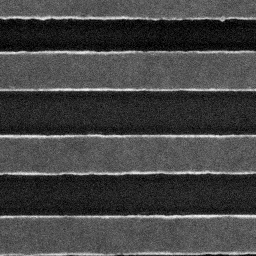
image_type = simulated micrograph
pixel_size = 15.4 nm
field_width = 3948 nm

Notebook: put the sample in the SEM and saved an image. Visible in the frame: lines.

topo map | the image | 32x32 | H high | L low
HHHHHHHHHHHHHHHHHHHHHHHHHHHHHHHH
HHHHHHHHHHHHHHHHHHHHHHHHHHHHHHHH
LLLLLLLLLLLLLLLLLLLLLLLLLLLHLLLL
LLLLLLLLLLLLLLLLLLLLLLLLLLLLLLLL
LLLLLLLLLLLLLLLLLLLLLLLLLLLLLLLL
LLLLLLLLLLLLLLLLLLLLLLLLLLLLLLLL
LLHHHHHHHHHHLLHHHHHHHHHHHHHHHHHH
HHHHHHHHHHHHHHHHHHHHHHHHHHHHHHHH
HHHHHHHHHHHHHHHHHHHHHHHHHHHHHHHH
HHHHHHHHHHHHHHHHHHHHHHHHHHHHHHHH
HHHHHHHHHHHHHHHHHHHHHHHHHHHHHHHH
LLLLLLLLLLLLLLLLLLLLLLLLLLLLLLLL
LLLLLLLLLLLLLLLLLLLLLLLLLLLLLLLL
LLLLLLLLLLLLLLLLLLLLLLLLLLLLLLLL
LLLLLLLLLLLLLLLLLLLLLLLLLLLLLLLL
LLLLLLLLLLLLLLLLLLLLLLLLLLLLLLLL
LLLLLLLLLLLLLLLLLLLLLLLLLLLLLLLL
HHHHHHHHHHHHHHHHHHHHHHHHHHHHHHHH
HHHHHHHHHHHHHHHHHHHHHHHHHHHHHHHH
HHHHHHHHHHHHHHHHHHHHHHHHHHHHHHHH
HHHHHHHHHHHHHHHHHHHHHHHHHHHHHHHH
HHHHHHHHHHHHHHHHHHHHHHHHHHHHHHHH
LLLLLLLLLLLLLLLLLLLLLLLLLLLLLLLL
LLLLLLLLLLLLLLLLLLLLLLLLLLLLLLLL
LLLLLLLLLLLLLLLLLLLLLLLLLLLLLLLL
LLLLLLLLLLLLLLLLLLLLLLLLLLLLLLLL
LLLLLLLLLLLLLLLLLLLLLLLLLLLLLLLL
HHHHHHHHHHHHHHHHHHHHHHHHHHHHHHHH
HHHHHHHHHHHHHHHHHHHHHHHHHHHHHHHH
HHHHHHHHHHHHHHHHHHHHHHHHHHHHHHHH
HHHHHHHHHHHHHHHHHHHHHHHHHHHHHHHH
HHHHHHHHHHHHHHHHHHHHHHHHHHHHHHHH